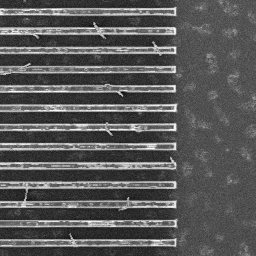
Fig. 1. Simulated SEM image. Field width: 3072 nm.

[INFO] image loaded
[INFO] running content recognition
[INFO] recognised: parallel lines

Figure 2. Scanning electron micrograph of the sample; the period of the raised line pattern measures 231 nanometers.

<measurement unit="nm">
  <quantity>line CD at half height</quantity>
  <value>74.3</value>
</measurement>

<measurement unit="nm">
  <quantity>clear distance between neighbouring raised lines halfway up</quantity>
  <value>161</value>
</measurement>